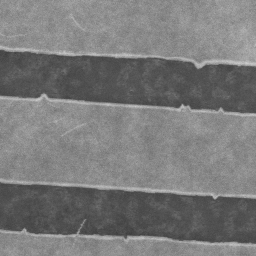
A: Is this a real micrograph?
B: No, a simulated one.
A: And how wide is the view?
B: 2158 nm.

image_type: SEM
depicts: one or a few lines or trenches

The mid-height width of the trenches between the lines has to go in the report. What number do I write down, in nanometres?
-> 418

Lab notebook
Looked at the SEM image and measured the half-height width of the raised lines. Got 696 nm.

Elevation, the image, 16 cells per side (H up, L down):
HHHHHHHHHHHHHHHH
HHHHHHHHHHHHHHHH
HHHHHHHHHHHHHHHH
LLLLLLLLLHHHHHHH
LLLLLLLLLLLLLLLL
LLLLLLLLLLLLLLLL
HHHHHHLLLLLLLLLL
HHHHHHHHHHHHHHHH
HHHHHHHHHHHHHHHH
HHHHHHHHHHHHHHHH
HHHHHHHHHHHHHHHH
LLLLHHHHHHHHHHHH
LLLLLLLLLLLLLLLL
LLLLLLLLLLLLLLLL
LLLLLLLLLLLLLLLL
HHHHHHHHHHHHHHHH